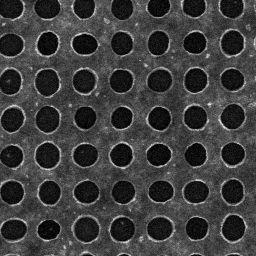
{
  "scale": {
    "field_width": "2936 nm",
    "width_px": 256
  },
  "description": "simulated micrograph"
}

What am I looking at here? a regular array of holes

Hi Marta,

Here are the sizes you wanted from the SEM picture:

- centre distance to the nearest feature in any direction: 0.418 microns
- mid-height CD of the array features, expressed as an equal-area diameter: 270 nm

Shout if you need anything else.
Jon